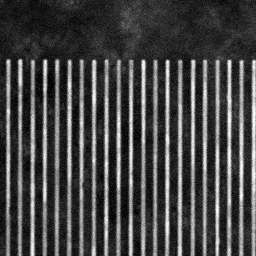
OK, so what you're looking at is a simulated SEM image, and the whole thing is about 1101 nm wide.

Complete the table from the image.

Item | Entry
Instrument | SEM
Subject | parallel lines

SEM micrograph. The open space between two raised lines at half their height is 41.4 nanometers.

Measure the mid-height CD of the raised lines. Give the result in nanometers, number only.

12.4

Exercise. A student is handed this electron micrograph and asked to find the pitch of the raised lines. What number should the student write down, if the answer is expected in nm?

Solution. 52.8